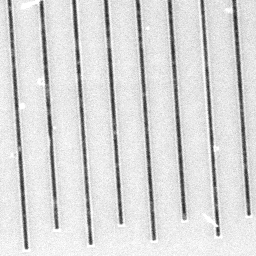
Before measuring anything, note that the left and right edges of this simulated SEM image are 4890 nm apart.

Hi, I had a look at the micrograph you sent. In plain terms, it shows parallel lines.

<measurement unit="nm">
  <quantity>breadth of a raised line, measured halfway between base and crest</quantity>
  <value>124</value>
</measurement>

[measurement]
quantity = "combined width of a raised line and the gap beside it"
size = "0.612 micrometres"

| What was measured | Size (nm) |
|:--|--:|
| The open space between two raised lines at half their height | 484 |